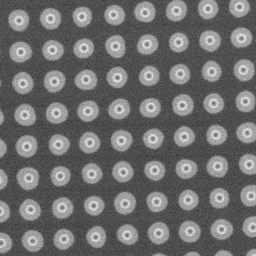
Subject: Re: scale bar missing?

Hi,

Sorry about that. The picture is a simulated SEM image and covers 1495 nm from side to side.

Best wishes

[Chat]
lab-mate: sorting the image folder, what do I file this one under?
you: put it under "an array of small figures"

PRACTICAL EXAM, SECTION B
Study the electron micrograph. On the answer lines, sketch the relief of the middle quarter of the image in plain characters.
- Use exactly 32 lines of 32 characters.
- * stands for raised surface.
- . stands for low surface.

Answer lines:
............................**..
............***.....***....****.
...*****...*****...*****..*****.
...*****...*****...*****...****.
...*****...****....****....****.
...*****....***.................
................................
................................
............................****
.....**.....****....****...*****
....****...*****...*****...*****
*..******..*****...*****...*****
*..******..*****...*****....***.
*...****....***.................
................................
................................
.....................**.....****
.....***....****....*****...****
*...*****...*****...*****...****
*...*****...*****...*****...****
*...*****...*****....***.....*..
*...****.....***................
................................
................................
..............*......***.....***
.....****....****...*****...****
*....****...*****...*****...****
*....****...*****...*****...****
*....****....****....***.....**.
*.....**........................
................................
................................